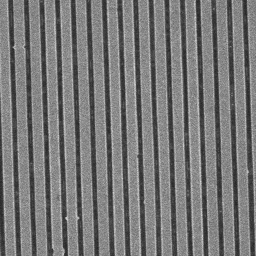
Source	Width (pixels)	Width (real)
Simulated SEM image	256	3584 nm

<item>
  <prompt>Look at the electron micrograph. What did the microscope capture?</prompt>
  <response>parallel lines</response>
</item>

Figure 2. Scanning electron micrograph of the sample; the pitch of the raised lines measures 219 nm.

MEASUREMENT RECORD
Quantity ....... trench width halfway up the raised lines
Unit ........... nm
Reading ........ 71.7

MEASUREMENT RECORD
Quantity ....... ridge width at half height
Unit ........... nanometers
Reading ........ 143